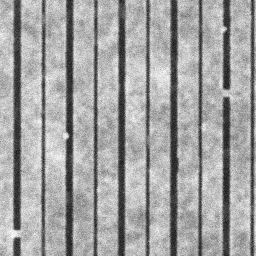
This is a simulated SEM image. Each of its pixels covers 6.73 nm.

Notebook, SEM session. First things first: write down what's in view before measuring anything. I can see parallel lines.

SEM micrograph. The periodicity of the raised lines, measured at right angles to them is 176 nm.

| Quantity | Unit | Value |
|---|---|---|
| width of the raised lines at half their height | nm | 130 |